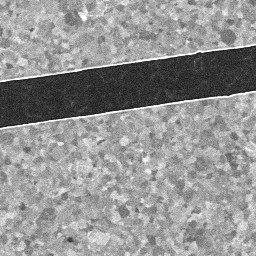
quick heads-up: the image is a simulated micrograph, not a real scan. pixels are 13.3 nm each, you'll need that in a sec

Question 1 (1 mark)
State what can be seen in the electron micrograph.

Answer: one or a few lines or trenches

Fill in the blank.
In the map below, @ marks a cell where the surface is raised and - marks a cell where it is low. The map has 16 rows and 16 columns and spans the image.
@@@@@@@@@@@@@@@@
@@@@@@@@@@@@@@@@
@@@@@@@@@@@@@@@@
@@@@@@@@@@@-----
@@@@------------
----------------
----------@@@@@@
----@@@@@@@@@@@@
@@@@@@@@@@@@@@@@
@@@@@@@@@@@@@@@@
@@@@@@@@@@@@@@@@
@@@@@@@@@@@@@@@@
@@@@@@@@@@@@@@@@
@@@@@@@@@@@@@@@@
@@@@@@@@@@@@@@@@
@@@@@@@@@@@@@@@@